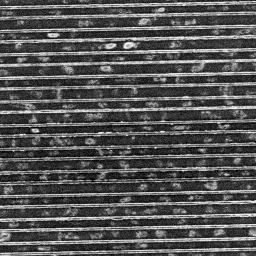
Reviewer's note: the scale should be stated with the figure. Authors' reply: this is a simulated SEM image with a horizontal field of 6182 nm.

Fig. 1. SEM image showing parallel lines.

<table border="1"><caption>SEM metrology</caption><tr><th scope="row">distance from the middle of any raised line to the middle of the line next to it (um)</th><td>0.283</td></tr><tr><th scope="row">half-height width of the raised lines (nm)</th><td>42.3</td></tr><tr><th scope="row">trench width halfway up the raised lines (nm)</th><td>211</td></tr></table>